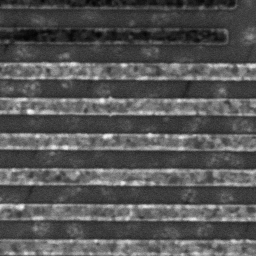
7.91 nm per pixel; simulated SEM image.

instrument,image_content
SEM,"parallel lines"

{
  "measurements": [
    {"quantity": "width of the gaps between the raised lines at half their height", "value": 158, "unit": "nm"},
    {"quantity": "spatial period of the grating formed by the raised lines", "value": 0.279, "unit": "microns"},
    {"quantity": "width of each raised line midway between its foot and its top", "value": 124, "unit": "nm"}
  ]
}